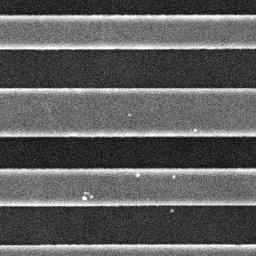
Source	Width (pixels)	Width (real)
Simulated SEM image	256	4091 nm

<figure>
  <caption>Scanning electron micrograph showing lines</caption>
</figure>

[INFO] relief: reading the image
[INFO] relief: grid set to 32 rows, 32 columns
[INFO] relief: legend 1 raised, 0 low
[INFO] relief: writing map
00000000000000000000000000000000
00000000000000000000000000000000
11111111111111111111111111111111
11111111111111111111111111111111
11111111111111111111111111111111
11111111111111111111111111111111
00000000000000000000000000000000
00000000000000000000000000000000
00000000000000000000000000000000
00000000000000000000000000000000
00000000000000000000000000000000
11111111111111111111111111111111
11111111111111111111111111111111
11111111111111111111111111111111
11111111111111111111111111111111
11111111111111111111111111111111
11111111111111111111111111111111
00000000000000000000000000000000
00000000000000000000000000000000
00000000000000000000000000000000
00000000000000000000000000000000
11111111111111111111111111111111
11111111111111111111111111111111
11111111111111111111111111111111
11111111111111111111111111111111
11111111111111111111111111111111
00000000000000000000000000000000
00000000000000000000000000000000
00000000000000000000000000000000
00000000000000000000000000000000
00000000000000000000000000000000
11111111111111111111111111111111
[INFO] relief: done